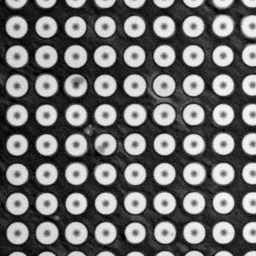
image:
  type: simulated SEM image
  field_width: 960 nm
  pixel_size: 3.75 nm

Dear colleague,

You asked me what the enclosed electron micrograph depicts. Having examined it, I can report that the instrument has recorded an array of small figures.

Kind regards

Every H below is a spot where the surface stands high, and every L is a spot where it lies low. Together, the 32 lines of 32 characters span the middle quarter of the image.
LHHHHLLLLHHLLLLLLHHLLLLLHHLLLLLH
LLLLLLLLLLLLLLLLLLLLLLLLLLLLLLLL
LLLLLLLLLLLLLLLLLLLLLLLLLLLLLLLL
LHHHHLLLHHHHLLLLHHHHLLLHHHHLLLLH
HHHHHHLLHHHHHLLHHHHHLLHHHHHHLLHH
HHHHHHLLHHHHHLLHHHHHLLHHHHHHLLHH
HHHHHHLLHHHHHLLHHHHHLLHHHHHHLLHH
LHHHHLLLLHHHLLLLHHHHLLLHHHHLLLLH
LLLLLLLLLLLLLLLLLLLLLLLLLLLLLLLL
LLLLLLLLLLLLLLLLLLLLLLLLLLLLLLLL
LLHHLLLLLHHHLLLLHHHLLLLHHHHLLLLH
LHHHHLLLHHHHHLLHHHHHLLLHHHHLLLHH
LHHHHHLLHHHHHLLHHHHHLLLHHHHHLLHH
LHHHHHLLHHHHHLLHHHHHLLLHHHHHLLHH
LHHHHLLLHHHHLLLLHHHHLLLHHHHLLLHH
LLLLLLLLLLLLLLLLLLLLLLLLLLLLLLLL
LLLLLLLLLLLLLLLLLLLLLLLLLLLLLLLL
LLLLLLLLLLLLLLLLLHLLLLLLLLLLLLLL
LHHHHLLLHHHHLLLLHHHHLLLHHHHLLLHH
HHHHHHLLHHHHHLLHHHHHLLLHHHHHLLHH
HHHHHHLLHHHHHLLHHHHHLLLHHHHHLLHH
LHHHHLLLHHHHHLLLHHHHLLLHHHHLLLHH
LLHHLLLLLHHHLLLLLHHLLLLLHHLLLLLL
LLLLLLLLLLLLLLLLLLLLLLLLLLLLLLLL
LLLLLLLLLLLLLLLLLLLLLLLLLLLLLLLL
LHHHHLLLLHHHLLLLHHHHLLLHHHHLLLLH
LHHHHLLLHHHHHLLHHHHHLLLHHHHHLLHH
LHHHHHLLHHHHHLLHHHHHLLLHHHHHLLHH
LHHHHLLLHHHHHLLHHHHHLLLHHHHHLLHH
LHHHHLLLLHHHLLLLHHHHLLLHHHHLLLLH
LLLLLLLLLLLLLLLLLLLLLLLLLLLLLLLL
LLLLLLLLLLLLLLLLLLLLLLLLLLLLLLLL